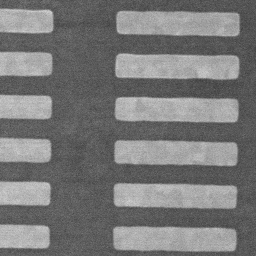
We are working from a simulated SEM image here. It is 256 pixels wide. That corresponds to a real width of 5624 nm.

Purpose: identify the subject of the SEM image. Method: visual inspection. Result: groups of lines, slits or small figures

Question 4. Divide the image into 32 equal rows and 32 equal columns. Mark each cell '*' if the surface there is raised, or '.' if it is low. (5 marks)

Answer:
................................
******.........*................
*******........***************..
*******........***************..
................................
................................
................................
******.........***************..
******.........***************..
...............***************..
................................
................................
******.........**************...
******.........***************..
******.........***************..
................................
................................
*****...........................
******........****************..
******........****************..
........................*****...
................................
................................
******........***************...
******........****************..
..****.........**************...
................................
................................
******.........****.**..........
******........***************...
******........***************...
................................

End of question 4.